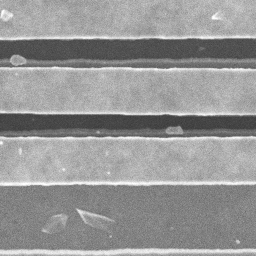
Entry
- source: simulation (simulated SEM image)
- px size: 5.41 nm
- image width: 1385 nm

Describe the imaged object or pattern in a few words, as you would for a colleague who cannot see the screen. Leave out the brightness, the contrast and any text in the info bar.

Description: lines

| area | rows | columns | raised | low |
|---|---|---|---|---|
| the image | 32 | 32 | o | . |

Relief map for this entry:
oooooooooooooooooooooooooooooooo
oooooooooooooooooooooooooooooooo
oooooooooooooooooooooooooooooooo
oooooooooooooooooooooooooooooooo
oooooooooooooooooooooooooooooooo
................................
................................
................................
ooooooooo..oooooo...............
oooooooooooooooooooooooooooooooo
oooooooooooooooooooooooooooooooo
oooooooooooooooooooooooooooooooo
oooooooooooooooooooooooooooooooo
oooooooooooooooooooooooooooooooo
................................
................................
................................
oooooooooooooooooooooooooooooooo
oooooooooooooooooooooooooooooooo
oooooooooooooooooooooooooooooooo
oooooooooooooooooooooooooooooooo
oooooooooooooooooooooooooooooooo
oooooooooooooooooooooooooooooooo
................................
................................
................................
................................
................................
................................
................................
................................
................................